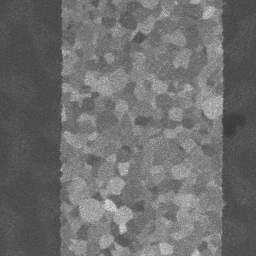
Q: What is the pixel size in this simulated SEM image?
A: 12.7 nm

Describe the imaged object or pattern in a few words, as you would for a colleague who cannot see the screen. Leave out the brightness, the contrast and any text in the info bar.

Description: one or a few lines or trenches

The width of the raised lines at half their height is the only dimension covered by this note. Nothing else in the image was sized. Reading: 160 px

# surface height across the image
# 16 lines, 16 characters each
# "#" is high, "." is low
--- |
....##########..
....##########..
....##########..
....##########..
....##########..
....##########..
....##########..
....##########..
....##########..
....##########..
....##########..
....##########..
....##########..
....##########..
....##########..
....##########..